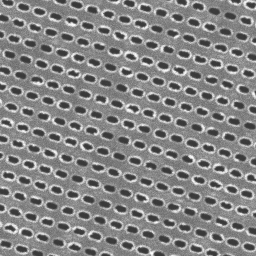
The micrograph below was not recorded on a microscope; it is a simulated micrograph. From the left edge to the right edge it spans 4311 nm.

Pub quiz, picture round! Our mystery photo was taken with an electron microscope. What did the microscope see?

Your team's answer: a regular array of holes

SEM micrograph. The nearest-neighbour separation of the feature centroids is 0.276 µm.